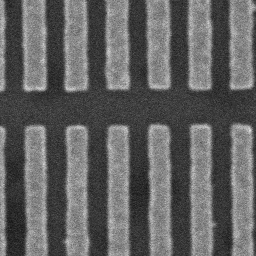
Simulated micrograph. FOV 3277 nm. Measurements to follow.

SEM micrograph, wiring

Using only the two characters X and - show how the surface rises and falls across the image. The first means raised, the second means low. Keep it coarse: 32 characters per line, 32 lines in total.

---XXX--XXX--XXX--XXX---XX---XX-
X--XXX--XXX--XXX--XXX---XX---XX-
X--XXX--XXX--XXX--XXX---XX---XXX
X--XXX--XXX--XXX--XXX---XX---XXX
X--XXX--XXX--XXX--XXX---XX---XX-
X--XXX--XXX--XXX---XX---XX---XX-
---XXX--XXX--XXX---XX---XX---XX-
X--XXX--XXX--XXX---XX---XX---XX-
X--XXX--XXX--XXX---XX---XX---XXX
X--XXX--XXX--XXX---XX---XX---XXX
X--XXX--XXX--XXX---XX---XX---XXX
--------------------------------
--------------------------------
--------------------------------
--------------------------------
--------------------------------
X--XX---XXX---XX---XX---XX---XX-
X--XXX--XXX--XXX---XX---XX---XX-
---XXX--XXX--XXX---XX---XX---XX-
---XXX---XX---XX---XX---XX---XX-
---XXX---XX---XX---XX---XX---XX-
X--XXX---XX---XX---XX---XX---XX-
X--XXX--XXX---XX---XX---XX---XXX
X--XXX--XXX---XX---XX---XX---XXX
X--XXX--XXX---XX---XX---XX---XXX
X--XXX---XX---XX---XX---XX---XXX
X--XXX--XXX---XX---XX---XX---XXX
X--XXX--XXX---XX---XX---XX---XXX
X--XXX--XXX---XX---XX---XX---XXX
X--XXX--XXX---XX---XX---XX---XX-
X--XXX--XXX---XX---XX---XX---XXX
X--XXX--XXX---XX---XX---XX---XXX